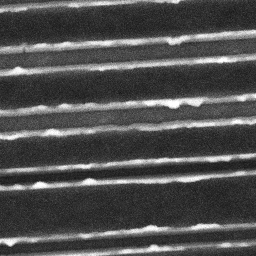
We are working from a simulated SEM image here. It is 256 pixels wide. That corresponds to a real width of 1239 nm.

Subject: one or a few lines or trenches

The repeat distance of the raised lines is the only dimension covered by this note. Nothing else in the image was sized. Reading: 0.296 microns